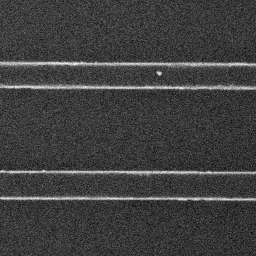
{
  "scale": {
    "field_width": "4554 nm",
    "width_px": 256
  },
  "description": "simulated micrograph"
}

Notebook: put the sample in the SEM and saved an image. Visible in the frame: lines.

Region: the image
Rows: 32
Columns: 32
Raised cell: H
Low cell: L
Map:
LLLLLLLLLLLLLLLLLLLLLLLLLLLLLLLL
LLLLLLLLLLLLLLLLLLLLLLLLLLLLLLLL
LLLLLLLLLLLLLLLLLLLLLLLLLLLLLLLL
LLLLLLLLLLLLLLLLLLLLLLLLLLLLLLLL
LLLLLLLLLLLLLLLLLLLLLLLLLLLLLLLL
LLLLLLLLLLLLLLLLLLLLLLLLLLLLLLLL
LLLLLLLLLLLLLLLLLLLLLLLLLLLLLLLL
LLLLLLLLLLLLLLLLLLLLLLLLLLLLLLLL
HHHHHHHHHHHHHHHHHHHHHHHHHHHHHHHH
HHHHHHHHHHHHHHHHHHHHHHHHHHHHHHHH
HHHHHHHHHHHHHHHHHHHHHHHHHHHHHHHH
LLLLLLLLLLLLLLLLLLLLLLLLLLLLLLLL
LLLLLLLLLLLLLLLLLLLLLLLLLLLLLLLL
LLLLLLLLLLLLLLLLLLLLLLLLLLLLLLLL
LLLLLLLLLLLLLLLLLLLLLLLLLLLLLLLL
LLLLLLLLLLLLLLLLLLLLLLLLLLLLLLLL
LLLLLLLLLLLLLLLLLLLLLLLLLLLLLLLL
LLLLLLLLLLLLLLLLLLLLLLLLLLLLLLLL
LLLLLLLLLLLLLLLLLLLLLLLLLLLLLLLL
LLLLLLLLLLLLLLLLLLLLLLLLLLLLLLLL
LLLLLLLLLLLLLLLLLLLLLLLLLLLLLLLL
HHHHHHHHHHHHHHHHHLLLLLLLLLLLLLLL
HHHHHHHHHHHHHHHHHHHHHHHHHHHHHHHH
HHHHHHHHHHHHHHHHHHHHHHHHHHHHHHHH
HHHHHHHHHHHHHHHHHHHHHHHHHHHHHHHH
LLLLLLLLLLLLLLLLLLLLLLLLLLLLLLLL
LLLLLLLLLLLLLLLLLLLLLLLLLLLLLLLL
LLLLLLLLLLLLLLLLLLLLLLLLLLLLLLLL
LLLLLLLLLLLLLLLLLLLLLLLLLLLLLLLL
LLLLLLLLLLLLLLLLLLLLLLLLLLLLLLLL
LLLLLLLLLLLLLLLLLLLLLLLLLLLLLLLL
LLLLLLLLLLLLLLLLLLLLLLLLLLLLLLLL